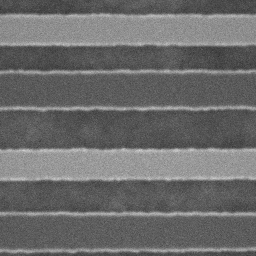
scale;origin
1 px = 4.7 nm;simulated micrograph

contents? lines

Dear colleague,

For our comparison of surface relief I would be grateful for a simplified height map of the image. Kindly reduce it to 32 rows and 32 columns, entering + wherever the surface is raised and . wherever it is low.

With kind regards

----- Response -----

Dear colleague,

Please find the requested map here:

................................
................................
++++++++++++++++++++++++++++++++
++++++++++++++++++++++++++++++++
++++++++++++++++++++++++++++++++
++++++++++++++++++++++++++++++++
................................
................................
................................
++++++++++++++++++++++++++++++++
++++++++++++++++++++++++++++++++
++++++++++++++++++++++++++++++++
++++++++++++++++++++++++++++++++
++++++++++++++++++++++++++++++++
................................
................................
................................
................................
................................
++++++++++++++++++++++++++++++++
++++++++++++++++++++++++++++++++
++++++++++++++++++++++++++++++++
................................
................................
................................
................................
................................
++++++++++++++++++++++++++++++++
++++++++++++++++++++++++++++++++
++++++++++++++++++++++++++++++++
++++++++++++++++++++++++++++++++
.+.+....+.......................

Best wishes